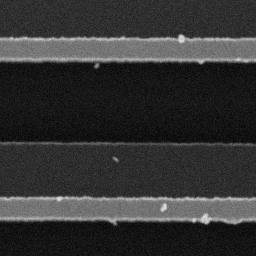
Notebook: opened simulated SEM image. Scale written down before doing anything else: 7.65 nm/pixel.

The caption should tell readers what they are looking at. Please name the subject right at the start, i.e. lines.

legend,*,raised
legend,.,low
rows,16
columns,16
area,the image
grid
****************
****************
****************
****************
................
................
................
................
................
****************
****************
****************
****************
****************
................
................